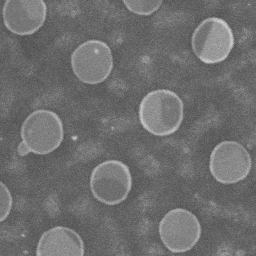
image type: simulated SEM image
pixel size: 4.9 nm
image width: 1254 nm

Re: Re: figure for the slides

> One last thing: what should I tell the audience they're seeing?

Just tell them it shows raised bodies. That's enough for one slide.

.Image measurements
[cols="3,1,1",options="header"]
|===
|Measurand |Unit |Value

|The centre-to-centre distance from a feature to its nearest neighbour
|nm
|416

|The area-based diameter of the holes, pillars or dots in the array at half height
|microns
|0.202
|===